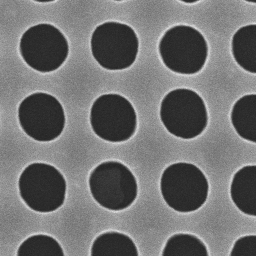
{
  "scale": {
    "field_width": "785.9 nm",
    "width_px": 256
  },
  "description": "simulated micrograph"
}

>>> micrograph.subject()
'a regular array of holes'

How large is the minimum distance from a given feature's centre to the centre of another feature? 211 nm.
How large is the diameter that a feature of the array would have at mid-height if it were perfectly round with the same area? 48.4 pixels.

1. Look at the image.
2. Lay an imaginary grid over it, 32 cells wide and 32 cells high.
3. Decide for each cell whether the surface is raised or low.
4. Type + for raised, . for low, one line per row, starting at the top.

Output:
++++++++++++++++++++++++++++++++
++++++++++++++++++++++++++++++++
++++++++++++++++++++++++++++++++
++++...+++++....++++++..++++++..
+++.....+++......+++.....++++...
++.......++......+++......+++...
+++......+++.....+++......+++...
+++.....++++.....+++......+++...
++++...++++++...+++++....+++++..
++++++++++++++++++++++++++++++++
++++++++++++++++++++++++++++++++
+++++++++++++++++++++...++++++++
+++....+++++....++++.....+++++..
++......+++......+++......+++...
++......+++......+++......+++...
+++.....+++......+++......+++...
+++.....++++.....++++....+++++..
+++++.+++++++...+++++++++++++++.
++++++++++++++++++++++++++++++++
++++++++++++++++++++++++++++++++
++++..+++++++..+++++++..++++++++
+++....+++++....++++.....+++++..
++......+++......+++......+++...
++......+++......+++......+++...
+++.....+++......+++......+++...
+++.....++++....+++++....++++...
++++++++++++++++++++++..++++++..
++++++++++++++++++++++++++++++++
++++++++++++++++++++++++++++++++
++++..++++++....+++++...+++++++.
+++....+++++.....++++....++++...
++......+++......+++......+++...